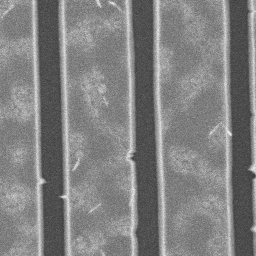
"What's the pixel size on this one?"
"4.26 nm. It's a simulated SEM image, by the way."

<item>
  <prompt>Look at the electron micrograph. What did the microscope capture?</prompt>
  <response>one or a few lines or trenches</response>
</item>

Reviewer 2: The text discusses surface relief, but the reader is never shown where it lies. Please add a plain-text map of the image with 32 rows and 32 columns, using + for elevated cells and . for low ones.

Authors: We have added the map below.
++++....++++++++...+++++++++...+
++++....++++++++...+++++++++...+
++++....++++++++...+++++++++...+
++++....++++++++....++++++++...+
++++....++++++++...+++++++++...+
+++++...++++++++...+++++++++...+
+++++...++++++++...+++++++++...+
+++++...++++++++....++++++++...+
+++++...++++++++...+++++++++...+
+++++...++++++++...+++++++++....
+++++...++++++++...+++++++++....
+++++...+++++++++..+++++++++....
+++++...+++++++++...+++++++++...
+++++...+++++++++...+++++++++...
+++++...+++++++++...+++++++++...
+++++...+++++++++...+++++++++...
+++++...+++++++++...+++++++++...
+++++...+++++++++...+++++++++...
+++++...+++++++++...+++++++++...
+++++...++++++++....+++++++++...
+++++...+++++++++...+++++++++...
+++++...+++++++++...+++++++++...
+++++...+++++++++...+++++++++...
+++++...+++++++++...+++++++++...
+++++...+++++++++...+++++++++...
+++++...+++++++++...+++++++++...
+++++...+++++++++...+++++++++...
+++++...+++++++++...+++++++++...
+++++...+++++++++...+++++++++...
+++++...+++++++++...+++++++++...
+++++...+++++++++...+++++++++...
+++++...+++++++++...+++++++++...